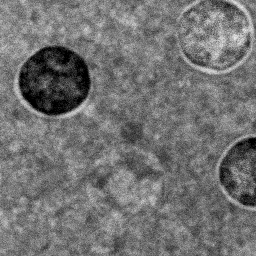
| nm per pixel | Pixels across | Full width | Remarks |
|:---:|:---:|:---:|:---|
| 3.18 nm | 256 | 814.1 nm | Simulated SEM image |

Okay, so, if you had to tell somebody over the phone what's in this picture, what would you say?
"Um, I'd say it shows holes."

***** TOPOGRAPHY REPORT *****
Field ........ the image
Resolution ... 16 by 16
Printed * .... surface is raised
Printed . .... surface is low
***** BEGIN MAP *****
************...*
***********.....
***********.....
**...*******...*
*.....**********
*.....**********
**...***********
****************
****************
**************..
**************..
**************..
***************.
****************
****************
****************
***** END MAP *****